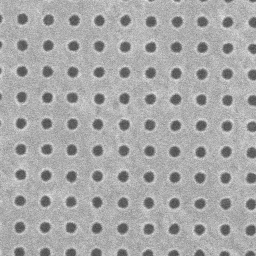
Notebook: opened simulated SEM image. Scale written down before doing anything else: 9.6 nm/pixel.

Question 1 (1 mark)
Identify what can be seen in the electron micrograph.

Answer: a regular array of holes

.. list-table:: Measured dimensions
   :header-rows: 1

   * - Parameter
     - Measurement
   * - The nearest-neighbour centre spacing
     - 25.4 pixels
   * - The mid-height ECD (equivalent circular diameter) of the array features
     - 0.117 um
